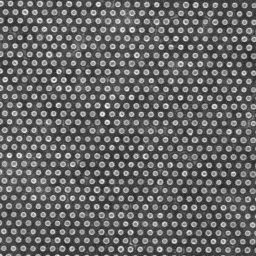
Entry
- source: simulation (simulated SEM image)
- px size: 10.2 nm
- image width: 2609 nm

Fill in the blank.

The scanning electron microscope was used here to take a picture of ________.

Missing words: a regular array of raised bodies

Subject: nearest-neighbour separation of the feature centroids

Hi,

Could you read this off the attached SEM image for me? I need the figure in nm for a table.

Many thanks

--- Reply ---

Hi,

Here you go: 96.8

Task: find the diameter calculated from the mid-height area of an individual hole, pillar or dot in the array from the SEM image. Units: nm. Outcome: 55.1